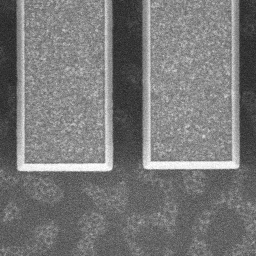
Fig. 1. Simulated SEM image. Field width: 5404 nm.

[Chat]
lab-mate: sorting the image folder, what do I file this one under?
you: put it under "one or a few lines or trenches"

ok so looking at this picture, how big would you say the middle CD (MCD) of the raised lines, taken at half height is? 1860 nm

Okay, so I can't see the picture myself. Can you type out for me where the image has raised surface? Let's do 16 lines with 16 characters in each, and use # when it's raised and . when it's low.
.######..######.
.######..######.
.######..######.
.######..######.
.######..######.
.######..######.
.######..######.
.######..######.
.######..######.
.######..######.
................
................
................
................
................
................